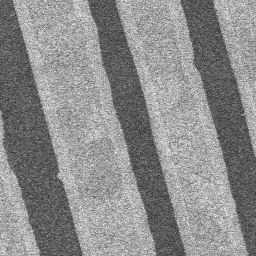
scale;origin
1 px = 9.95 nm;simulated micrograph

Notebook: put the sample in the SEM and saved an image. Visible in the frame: one or a few lines or trenches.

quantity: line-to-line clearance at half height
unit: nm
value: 442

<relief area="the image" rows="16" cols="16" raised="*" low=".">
.****...***...**
..****..***...**
..****..***...**
..****...***...*
..****...***...*
...***...***...*
...****...***...
...****...***...
....***...***...
....****..***...
....****...***..
*...****...***..
*....***...***..
*....****..***..
**...****...***.
**...****...***.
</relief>